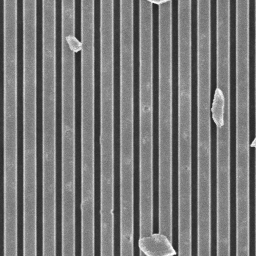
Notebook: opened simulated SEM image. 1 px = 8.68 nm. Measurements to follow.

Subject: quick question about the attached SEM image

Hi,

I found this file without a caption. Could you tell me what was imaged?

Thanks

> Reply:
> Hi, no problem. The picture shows parallel lines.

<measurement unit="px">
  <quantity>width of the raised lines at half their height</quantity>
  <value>12.7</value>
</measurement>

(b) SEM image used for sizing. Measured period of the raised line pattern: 168 nm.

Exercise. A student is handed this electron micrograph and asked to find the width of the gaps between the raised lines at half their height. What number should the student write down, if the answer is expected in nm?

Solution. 59.6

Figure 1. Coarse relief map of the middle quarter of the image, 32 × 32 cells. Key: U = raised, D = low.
UUUDDUUDDUUUDDUUUDDUUUDDUUUDDUUU
UUUDDUUDDUUUDDUUUDDUUUDDUUUDDUUU
UUUDDUUDDUUUDDUUUDDUUUDDUUUDDUUU
UUUDDUUDDUUUDDUUUDDUUUDDUUUDDUUU
UUUDDUUDDUUUDDUUUDDUUUDDUUUDDUUU
UUUDDUUDDUUUDDUUUDDUUUDDUUUDDUUU
UUUDDUUDDUUUDDUUUDDUUUDDUUUDDUUU
UUUDDUUDDUUUDDUUUDDUUUDDUUUDDUUU
UUUDDUUDDUUUDDUUUDDUUUDDUUUDDUUU
UUUDDUUDDUUUDDUUUDDUUUDDUUUDDUUU
UUUDDUUDDUUUDDUUUDDUUUDDUUUDDUUU
UUUDDUUDDUUUDDUUUDDUUUDDUUUDDUUU
UUUDDUUDDUUUDDUUUDDUUUDDUUUDDUUU
UUUDDUUDDUUUDDUUUDDUUUDDUUUDDUUU
UUUDDUUDDUUUDDUUUDDUUUDDUUUDDUUU
UUUDDUUDDUUUDDUUUDDUUUDDUUUDDUUU
UUUDDUUDDUUUDDUUUDDUUUDDUUUDDUUU
UUUDDUUDDUUUDDUUUDDUUUDDUUUDDUUU
UUUDDUUDDUUUDDUUUDDUUUDDUUUDDUUU
UUUDDUUDDUUUDDUUUDDUUUDDUUUDDUUU
UUUDDUUDDUUUDDUUUDDUUUDDUUUDDUUU
UUUDDUUDDUUUDDUUUDDUUUDDUUUDDUUU
UUUDDUUDDUUUDDUUUDDUUUDDUUUDDUUU
UUUDDUUDDUUUDDUUUDDUUUDDUUUDDUUU
UUUDDUUDDUUUDDUUUDDUUUDDUUUDDUUU
UUUDDUUDDUUUDDUUUDDUUUDDUUUDDUUU
UUUDDUUDDUUUDDUUUDDUUUDDUUUDDUUU
UUUDDUUDDUUUDDUUUDDUUUDDUUUDDUUU
UUUDDUUDDUUUDDUUUDDUUUDDUUUDDUUU
UUUDDUUDDUUUDDUUUDDUUUDDUUUDDUUU
UUUDDUUDDUUUDDUUUDDUUUDDUUUDDUUU
UUUDDUUDDUUUDDUUUDDUUUDDUUUDDUUU